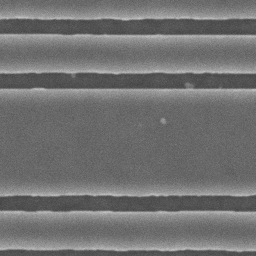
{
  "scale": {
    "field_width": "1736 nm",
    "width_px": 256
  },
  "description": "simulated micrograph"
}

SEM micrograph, lines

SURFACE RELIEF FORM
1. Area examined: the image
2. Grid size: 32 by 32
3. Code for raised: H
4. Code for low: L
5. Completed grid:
HHHHHHHHHHHHHHHHHHHHHHHHHHHHHHHH
HHHHHHHHHHHHHHHHHHHHHHHHHHHHHHHH
LLLLLLLLLLLLLLLLLLLLLLLLLLLLLLLL
LLLLLLLLLLLLLLLLLLLLLLLLLLLLLLLL
HHHHHHHHHHHHHHHHHHHHHHHHHHHHHHHH
HHHHHHHHHHHHHHHHHHHHHHHHHHHHHHHH
HHHHHHHHHHHHHHHHHHHHHHHHHHHHHHHH
HHHHHHHHHHHHHHHHHHHHHHHHHHHHHHHH
HHHHHHHHHHHHHHHHHHHHHHHHHHHHHHHH
LLLLLLLLLLLLLLLLLLLLLLLLLLLLLLLL
LLLLLLLLLLLLLLLLLLLLLLLLLLLLLLLL
HHHHHHHHHHHHHHHHHHHHHHHHHHHHHHHH
HHHHHHHHHHHHHHHHHHHHHHHHHHHHHHHH
HHHHHHHHHHHHHHHHHHHHHHHHHHHHHHHH
HHHHHHHHHHHHHHHHHHHHHHHHHHHHHHHH
HHHHHHHHHHHHHHHHHHHHHHHHHHHHHHHH
HHHHHHHHHHHHHHHHHHHHHHHHHHHHHHHH
HHHHHHHHHHHHHHHHHHHHHHHHHHHHHHHH
HHHHHHHHHHHHHHHHHHHHHHHHHHHHHHHH
HHHHHHHHHHHHHHHHHHHHHHHHHHHHHHHH
HHHHHHHHHHHHHHHHHHHHHHHHHHHHHHHH
HHHHHHHHHHHHHHHHHHHHHHHHHHHHHHHH
HHHHHHHHHHHHHHHHHHHHHHHHHHHHHHHH
HHHHHHHHHHHHHHHHHHHHHHHHHHHHHHHH
LLLLLLLLLLLLLLLLLLLLLLLLLLLLLLLL
LLLLLLLLLLLLLLLLLLLLLLLLLLLLLLLL
HHHLLHLLLHHHLHLLLLLLHLHHHHHHHLLL
HHHHHHHHHHHHHHHHHHHHHHHHHHHHHHHH
HHHHHHHHHHHHHHHHHHHHHHHHHHHHHHHH
HHHHHHHHHHHHHHHHHHHHHHHHHHHHHHHH
HHHHHHHHHHHHHHHHHHHHHHHHHHHHHHHH
LLLLLLLLLLLLLLLLLLLLLLLLLLLLLLLL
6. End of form